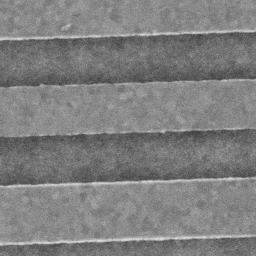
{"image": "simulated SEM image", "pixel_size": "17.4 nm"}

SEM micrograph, lines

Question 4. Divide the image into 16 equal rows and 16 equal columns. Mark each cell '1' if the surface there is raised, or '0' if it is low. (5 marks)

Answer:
1111111111111111
1111111111111111
0000000000000000
0000000000000000
0000000000000000
1111111111111111
1111111111111111
1111111111111111
0000000000000000
0000000000000000
0000000000000000
0000111111111111
1111111111111111
1111111111111111
1111111111111111
0000000000000000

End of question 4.